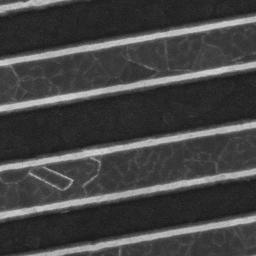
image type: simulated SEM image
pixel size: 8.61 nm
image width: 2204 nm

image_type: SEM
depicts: one or a few lines or trenches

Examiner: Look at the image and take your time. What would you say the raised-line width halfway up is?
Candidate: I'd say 394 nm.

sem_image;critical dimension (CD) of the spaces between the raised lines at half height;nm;462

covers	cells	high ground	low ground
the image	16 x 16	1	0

0000000000000000
0000000000000011
0000000011111111
0001111111111111
1111111111111000
1111111100000000
1100000000000000
0000000000000000
0000000000001111
0000001111111111
1111111111111111
1111111111100000
1111110000000000
0000000000000000
0000000000011111
0000011111111111